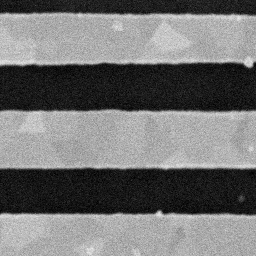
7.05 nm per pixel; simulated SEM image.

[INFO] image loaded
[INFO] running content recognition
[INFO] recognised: lines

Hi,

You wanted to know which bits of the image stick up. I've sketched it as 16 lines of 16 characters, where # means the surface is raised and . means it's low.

................
################
################
################
................
................
................
################
################
################
.####.###.#...##
................
................
################
################
################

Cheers